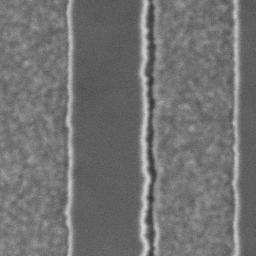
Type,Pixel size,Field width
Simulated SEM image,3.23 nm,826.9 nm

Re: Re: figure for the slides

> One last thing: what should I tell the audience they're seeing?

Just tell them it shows lines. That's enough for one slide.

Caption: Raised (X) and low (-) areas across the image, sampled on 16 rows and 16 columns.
----XXXXX------X
----XXXXX------X
----XXXXX------X
----XXXXX------X
----XXXXX------X
----XXXXX------X
----XXXXX------X
----XXXXX------X
----XXXXX------X
----XXXXX------X
----XXXXX------X
----XXXXX------X
----XXXXX------X
----XXXXX------X
----XXXXX------X
----XXXXX------X